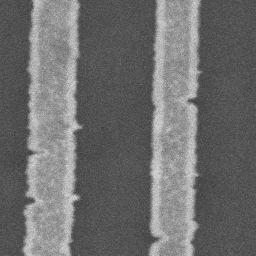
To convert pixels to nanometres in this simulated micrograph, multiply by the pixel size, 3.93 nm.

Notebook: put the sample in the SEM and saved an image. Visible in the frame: one or a few lines or trenches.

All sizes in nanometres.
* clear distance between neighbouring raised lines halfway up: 340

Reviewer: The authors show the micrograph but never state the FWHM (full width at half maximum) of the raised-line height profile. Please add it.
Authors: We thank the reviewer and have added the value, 0.137 microns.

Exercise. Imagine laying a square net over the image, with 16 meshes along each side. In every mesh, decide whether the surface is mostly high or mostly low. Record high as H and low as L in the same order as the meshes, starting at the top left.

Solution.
LLHHHLLLLLHHLLLL
LLHHHLLLLLHHLLLL
LLHHHLLLLLHHLLLL
LLHHHLLLLLHHLLLL
LLHHHLLLLLHHLLLL
LLHHLLLLLLHHLLLL
LLHHLLLLLLHHLLLL
LLHHHLLLLLHHLLLL
LLHHLLLLLLHHLLLL
LLHHLLLLLLHHLLLL
LLHHLLLLLLHHLLLL
LLHHLLLLLLHHLLLL
LLHHLLLLLLHHLLLL
LLHHLLLLLLHHLLLL
LLHHLLLLLLHHLLLL
LLHHLLLLLLHHLLLL